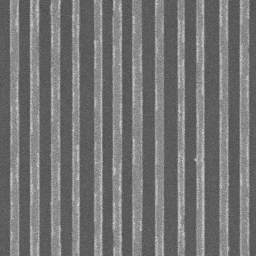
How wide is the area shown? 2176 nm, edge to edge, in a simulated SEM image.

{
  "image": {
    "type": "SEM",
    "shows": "parallel lines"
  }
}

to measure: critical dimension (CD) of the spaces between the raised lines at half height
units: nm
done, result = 107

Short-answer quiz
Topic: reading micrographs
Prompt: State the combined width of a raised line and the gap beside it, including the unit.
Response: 178 nanometres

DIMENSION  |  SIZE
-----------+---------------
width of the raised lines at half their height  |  66.9 nm